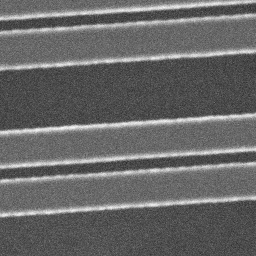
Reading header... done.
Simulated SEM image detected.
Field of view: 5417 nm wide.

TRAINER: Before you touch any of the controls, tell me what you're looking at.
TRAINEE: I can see lines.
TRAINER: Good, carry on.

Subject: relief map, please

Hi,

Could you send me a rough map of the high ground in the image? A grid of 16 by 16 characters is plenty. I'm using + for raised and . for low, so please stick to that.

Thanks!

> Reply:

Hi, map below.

++++++++++++++++
++++++++++++++++
++++++++++++++++
+++++++++++++...
................
................
................
...........+++++
++++++++++++++++
++++++++++++++++
++++++++++++++++
++++++++++++++++
++++++++++++++..
................
................
................